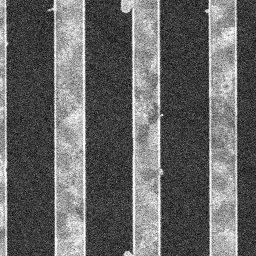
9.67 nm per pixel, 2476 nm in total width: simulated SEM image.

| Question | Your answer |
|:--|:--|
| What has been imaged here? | one or a few lines or trenches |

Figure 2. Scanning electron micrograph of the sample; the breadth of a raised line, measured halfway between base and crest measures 248 nm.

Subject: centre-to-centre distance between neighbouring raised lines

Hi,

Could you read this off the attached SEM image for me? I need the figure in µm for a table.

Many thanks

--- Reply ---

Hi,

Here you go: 0.742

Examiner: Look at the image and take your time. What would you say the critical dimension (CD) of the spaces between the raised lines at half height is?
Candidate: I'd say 486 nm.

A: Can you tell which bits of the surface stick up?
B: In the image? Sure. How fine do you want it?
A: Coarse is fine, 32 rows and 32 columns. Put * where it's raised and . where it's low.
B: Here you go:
*......***.....*****......***...
*......***.......***......***...
*......***.......***......***...
*......***.......***......***...
*......***.......***......***...
*......***.......***......***...
*......***.......***......***...
*......***.......***......***...
*......***.......***......***...
*......***.......***......***...
*......***.......***......***...
*......***.......***......***...
*......***.......***......***...
*......***.......***......***...
*......***.......***......***...
*......***.......***......***...
*......***.......***......***...
*......***.......***......***...
*......***.......***......***...
*......***.......***......***...
*......***.......***......***...
*......***.......***......***...
*......***.......***......***...
*......***.......***......***...
*......****......***......***...
*......****......***......***...
*......****......***......***...
*......****......***......***...
*......****......***......***...
*......****......***......***...
*......****......***......***...
*......****......***......***...